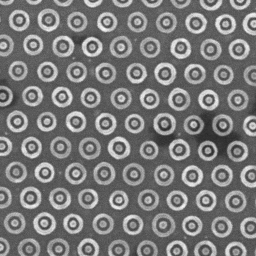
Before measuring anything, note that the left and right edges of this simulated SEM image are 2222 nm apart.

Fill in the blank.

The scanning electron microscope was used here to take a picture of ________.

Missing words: a regular array of ring-shaped raised bodies with a dot in the middle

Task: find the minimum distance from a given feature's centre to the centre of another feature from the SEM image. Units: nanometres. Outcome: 248